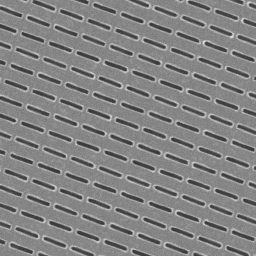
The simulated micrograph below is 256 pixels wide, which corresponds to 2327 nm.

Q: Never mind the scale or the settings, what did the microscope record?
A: a regular array of holes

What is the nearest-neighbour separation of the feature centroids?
152 nm